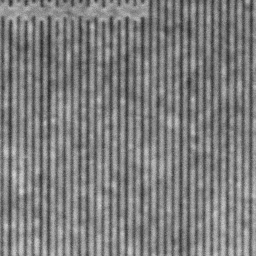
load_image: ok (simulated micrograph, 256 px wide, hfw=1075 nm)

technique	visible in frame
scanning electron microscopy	parallel lines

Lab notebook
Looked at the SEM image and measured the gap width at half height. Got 12.1 nm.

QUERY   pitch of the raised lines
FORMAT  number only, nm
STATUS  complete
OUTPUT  32.6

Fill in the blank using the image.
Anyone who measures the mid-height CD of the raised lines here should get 20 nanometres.